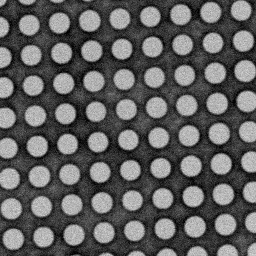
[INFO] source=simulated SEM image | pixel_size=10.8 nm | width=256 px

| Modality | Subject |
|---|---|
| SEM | an array of small figures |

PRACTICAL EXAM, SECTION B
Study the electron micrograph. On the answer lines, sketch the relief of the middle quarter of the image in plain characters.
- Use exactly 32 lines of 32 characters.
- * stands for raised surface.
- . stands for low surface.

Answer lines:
.............................**.
..............**.....***....****
*.....***....****...*****...****
**...*****...*****..*****...****
**...*****...****...*****...****
**...*****...****....***........
**....***.......................
................................
......................**.....***
..............***....****...****
**....****...*****...*****..****
***...****...*****...*****..****
***...****...*****...****....***
***...****....***...............
**..............................
...............................*
......................***....***
.......***....****...*****...***
***...*****...****...*****...***
***...*****...****...*****...***
***...*****...****....***.......
***....***......................
................................
..............................**
...............***....****...***
***....****...*****...*****..***
****...****...*****...*****..***
****...****...*****...****....**
****...****....***..............
***.....**......................
................................
........................**....**